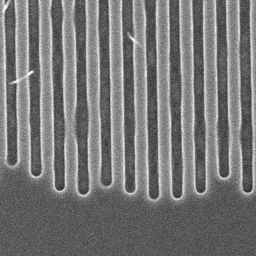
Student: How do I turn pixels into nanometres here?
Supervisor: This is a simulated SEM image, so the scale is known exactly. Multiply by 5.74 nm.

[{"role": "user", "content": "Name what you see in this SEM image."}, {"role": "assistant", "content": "groups of lines, slits or small figures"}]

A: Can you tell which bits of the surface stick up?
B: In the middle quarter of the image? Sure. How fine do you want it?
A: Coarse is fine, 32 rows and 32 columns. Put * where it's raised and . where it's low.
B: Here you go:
***...***...***...**...***...***
***...***...***...**...***...***
***...***...***...**...***....**
***...***...***...**...***....**
***...***...***...**...***....**
***...***...***...**...***....**
***...***...***...**...***....**
***...***...***...***..***....**
***...***...***...***..***....**
***...***...***...***...**....**
***...***...***...***...**....**
***...***...***...**....**....**
***...***...***...**....***...**
***...***...***...**....***...**
***...***...***...***...***...**
***...***...***...***...***...**
.**...***...***...***...***...**
***...***...***...***...***...**
***...***...***...***...***...**
***...***...***...***...***...**
***...***...***...***...***...**
***...***...***...***...***...**
***...***...***...***...***...**
***...***...***...***...***...**
***...***...***...***...***...**
***...***...***...***...***...**
***...***...***...***...***...**
***...***...***...***...***...**
***...***...***...***...***...**
***...***...***...***...***...**
***...****.****...***...***...**
***...*********...***...***...**